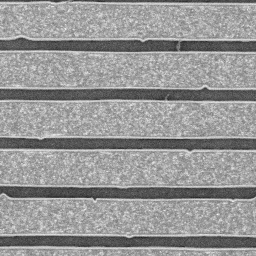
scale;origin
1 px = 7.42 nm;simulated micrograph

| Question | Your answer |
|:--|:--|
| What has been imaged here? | parallel lines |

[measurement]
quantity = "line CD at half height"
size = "0.275 µm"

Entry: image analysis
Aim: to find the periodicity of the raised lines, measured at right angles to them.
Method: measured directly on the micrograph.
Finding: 363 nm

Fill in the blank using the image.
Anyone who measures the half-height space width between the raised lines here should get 0.089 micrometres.